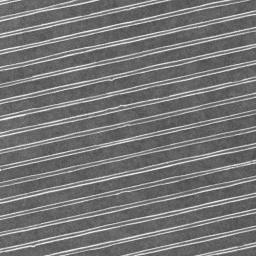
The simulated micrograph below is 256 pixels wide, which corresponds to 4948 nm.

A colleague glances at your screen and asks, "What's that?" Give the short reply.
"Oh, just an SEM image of parallel lines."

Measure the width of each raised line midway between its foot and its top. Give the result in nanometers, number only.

70.8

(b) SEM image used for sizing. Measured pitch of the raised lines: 313 nm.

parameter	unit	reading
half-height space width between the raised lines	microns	0.248